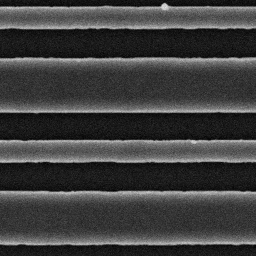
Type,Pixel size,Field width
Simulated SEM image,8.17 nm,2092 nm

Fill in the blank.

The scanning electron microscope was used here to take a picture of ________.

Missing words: lines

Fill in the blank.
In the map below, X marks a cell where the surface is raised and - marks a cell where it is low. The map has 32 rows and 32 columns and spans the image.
--------------------------------
XXXXXXXXXXXXXXXXXXXXXXXXXXXXXXXX
XXXXXXXXXXXXXXXXXXXXXXXXXXXXXXXX
X-XXXXXXXX------XX-XX--XX--X----
--------------------------------
--------------------------------
--------------------------------
XXXXXXXXXXXXXXXXXXXXXXXXXXXXXXXX
XXXXXXXXXXXXXXXXXXXXXXXXXXXXXXXX
XXXXXXXXXXXXXXXXXXXXXXXXXXXXXXXX
XXXXXXXXXXXXXXXXXXXXXXXXXXXXXXXX
XXXXXXXXXXXXXXXXXXXXXXXXXXXXXXXX
XXXXXXXXXXXXXXXXXXXXXXXXXXXXXXXX
XXXXXXXXXXXXXXXXXXXXXXXXXXXXXXXX
--------------------------------
--------------------------------
--------------------------------
--------------------------------
XXXXXXXXXXXXXXXXXXXXXXXXXXXXXXXX
XXXXXXXXXXXXXXXXXXXXXXXXXXXXXXXX
--------------------------------
--------------------------------
--------------------------------
--------------------------------
XXXXXXXXXXXXXXXXXXXXXXXXXXXXXXXX
XXXXXXXXXXXXXXXXXXXXXXXXXXXXXXXX
XXXXXXXXXXXXXXXXXXXXXXXXXXXXXXXX
XXXXXXXXXXXXXXXXXXXXXXXXXXXXXXXX
XXXXXXXXXXXXXXXXXXXXXXXXXXXXXXXX
XXXXXXXXXXXXXXXXXXXXXXXXXXXXXXXX
---XXX---XX----X----------------
--------------------------------